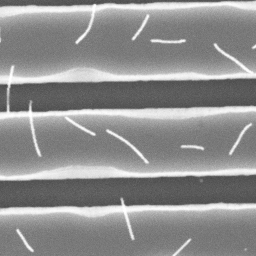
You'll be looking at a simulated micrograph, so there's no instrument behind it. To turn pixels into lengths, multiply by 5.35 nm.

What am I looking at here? lines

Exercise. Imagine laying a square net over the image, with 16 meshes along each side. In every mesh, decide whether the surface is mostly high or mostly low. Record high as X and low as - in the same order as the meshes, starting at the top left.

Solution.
-XXXXXXXXXXXXXXX
XXXXXXXXXXXXXXXX
XXXXXXXXXXXXXXXX
XXXXXXXXXXXXXXXX
XXXXXXXXXXXXXXXX
----------------
----------------
XXXXXXXXXXXXXXXX
XXXXXXXXXXXXXXXX
XXXXXXXXXXXXXXXX
XXXXXXXXXXXXXXXX
----------------
----------------
XXXXXXXXXXXXXXXX
XXXXXXXXXXXXXXXX
XXXXXXXXXXXXXXXX